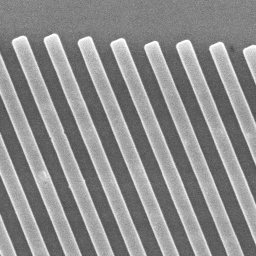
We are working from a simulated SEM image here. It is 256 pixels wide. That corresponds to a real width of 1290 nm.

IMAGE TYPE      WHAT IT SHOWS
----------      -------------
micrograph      parallel lines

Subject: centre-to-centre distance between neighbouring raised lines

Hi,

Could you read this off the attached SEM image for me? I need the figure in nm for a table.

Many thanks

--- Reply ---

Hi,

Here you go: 152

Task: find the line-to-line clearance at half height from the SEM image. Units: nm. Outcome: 78.3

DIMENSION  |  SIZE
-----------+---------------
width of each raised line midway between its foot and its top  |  73.6 nm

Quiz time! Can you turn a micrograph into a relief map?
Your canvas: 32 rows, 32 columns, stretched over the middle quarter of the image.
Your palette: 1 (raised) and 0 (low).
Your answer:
10000011110000111100001111000011
11000011110000111100001111000001
11000001110000011110000111000001
11000001111000011110000111100001
11100001111000011110000011100000
11110000111100001111000011110000
11110000111100001111000011110000
11110000011100000111100001110000
01111000011110000111100001111000
01111000011110000011100000111100
00111100001111000011110000111100
00111100001111000011110000111100
00111100000111000001111000011110
00011110000111100001111000011110
00011110000111100000111000001111
00001110000011110000111100001111
00001111000011110000111100001111
00001111000001110000011110000111
10000111100001111000011110000111
10000111100001111000001110000011
10000011100000111100001111000011
11000011110000111100001111000011
11000011110000011110000111100001
11100001111000011110000111100001
11100001111000011110000011100000
11100000111000001111000011110000
11110000111100001111000011110000
11110000111100000111100001111000
01111000011110000111100001111000
01111000011110000111100000111000
00111000001110000011110000111100
00111100001111000011110000111100